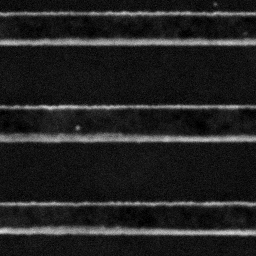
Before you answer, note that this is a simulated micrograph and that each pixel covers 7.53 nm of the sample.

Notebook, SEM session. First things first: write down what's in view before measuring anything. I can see lines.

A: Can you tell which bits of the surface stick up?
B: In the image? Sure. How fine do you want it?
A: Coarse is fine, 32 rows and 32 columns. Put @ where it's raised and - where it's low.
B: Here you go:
--------------------------------
--------------------------------
@@@@@@@@@@@@@@@@@@@@@@@@@@@@@@@@
@@@@@@@@@@@@@@@@@@@@@@@@@@@@@@@@
@@@@@@@@@@@@@@@@@@@@@@@@@@@@@@@@
--------------------------------
--------------------------------
--------------------------------
--------------------------------
--------------------------------
--------------------------------
--------------------------------
--------------------------------
@@@@@@@@@@@@@@@@@@@@@@@@@@@@@@@@
@@@@@@@@@@@@@@@@@@@@@@@@@@@@@@@@
@@@@@@@@@@@@@@@@@@@@@@@@@@@@@@@@
@@@@@@@@@@@@@@@@@@@@@@@@@@@@@@@@
--------------------------------
--------------------------------
--------------------------------
--------------------------------
--------------------------------
--------------------------------
--------------------------------
--------------------------------
@@@@@@@@@@@@@@@@@@@@@@@@@@@@@@@@
@@@@@@@@@@@@@@@@@@@@@@@@@@@@@@@@
@@@@@@@@@@@@@@@@@@@@@@@@@@@@@@@@
@@@@@@@@@@@@@@@@@@@@@@@@@@@@@@@@
--------------------------------
--------------------------------
--------------------------------